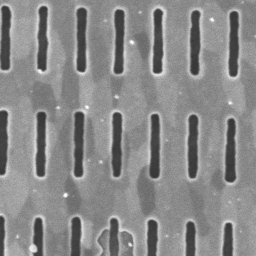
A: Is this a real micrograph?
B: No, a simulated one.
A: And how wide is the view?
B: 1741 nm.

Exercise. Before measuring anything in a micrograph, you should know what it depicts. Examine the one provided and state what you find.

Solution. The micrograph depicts a regular array of holes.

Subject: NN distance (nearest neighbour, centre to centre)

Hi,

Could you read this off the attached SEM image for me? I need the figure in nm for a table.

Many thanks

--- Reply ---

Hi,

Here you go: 258